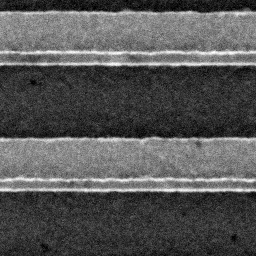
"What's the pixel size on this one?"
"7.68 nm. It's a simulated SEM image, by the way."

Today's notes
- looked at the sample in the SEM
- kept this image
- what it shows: lines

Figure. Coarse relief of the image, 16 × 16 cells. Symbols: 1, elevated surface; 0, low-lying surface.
0000000000000000
1111111111111111
1111111111111111
1111111111111111
0000000000000000
0000000000000000
0000000000000000
0000000000000000
0000000000000000
1111111111111111
1111111111111111
1111111111111111
0000000000000000
0000000000000000
0000000000000000
0000000000000000